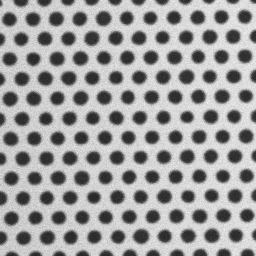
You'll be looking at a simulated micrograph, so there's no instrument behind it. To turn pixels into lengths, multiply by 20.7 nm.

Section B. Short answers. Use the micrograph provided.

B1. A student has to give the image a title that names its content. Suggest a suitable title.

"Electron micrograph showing a regular array of holes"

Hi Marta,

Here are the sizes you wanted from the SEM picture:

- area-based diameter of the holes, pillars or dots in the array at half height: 305 nanometers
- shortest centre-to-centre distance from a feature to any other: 470 nm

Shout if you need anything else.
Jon